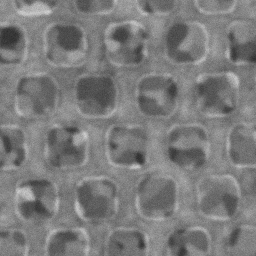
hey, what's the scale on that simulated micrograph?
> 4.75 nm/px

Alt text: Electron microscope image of a regular array of raised bodies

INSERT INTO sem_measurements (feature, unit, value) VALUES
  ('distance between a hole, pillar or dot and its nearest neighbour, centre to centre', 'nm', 280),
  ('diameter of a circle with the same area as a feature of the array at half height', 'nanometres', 216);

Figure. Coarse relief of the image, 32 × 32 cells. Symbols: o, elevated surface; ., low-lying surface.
..ooooo..ooooo...ooooo...oooo...
..oooo....oooo....ooo....ooo....
................................
ooo...oooo....oooo...oooo....ooo
ooo...ooooo..ooooo...ooooo..oooo
ooo...ooooo..ooooo...ooooo..oooo
ooo...ooooo..ooooo...ooooo..oooo
ooo...ooooo..ooooo...oooo....ooo
.............ooo................
....oo....ooooo...ooo....oooo...
..ooooo..ooooo...ooooo...ooooo..
..ooooo..oooooo..ooooo...ooooo..
..ooooo...ooooo..ooooo...ooooo..
..ooooo...oooo...ooooo...ooooo..
...ooo.....ooo....ooo......o....
..............................o.
ooo...oooo...ooooo...ooooo...ooo
ooo...ooooo..ooooo...ooooo...ooo
ooo...ooooo..oooooo..ooooo...ooo
ooo...ooooo..oooooo..ooooo...ooo
ooo...oooo....oooo....oooo...ooo
................................
...ooo....oooo...ooooo...oooo...
..ooooo...ooooo..ooooo...ooooo..
..ooooo...ooooo..ooooo...ooooo..
..ooooo...ooooo..ooooo...ooooo..
..ooooo...oooo...ooooo...ooooo..
...ooo.....ooo..................
........................o....ooo
ooo...ooooo...oooo...ooooo...ooo
ooo...ooooo..ooooo...ooooo...ooo
ooo...ooooo..ooooo...ooooo...ooo